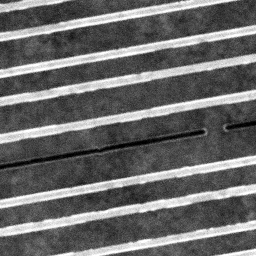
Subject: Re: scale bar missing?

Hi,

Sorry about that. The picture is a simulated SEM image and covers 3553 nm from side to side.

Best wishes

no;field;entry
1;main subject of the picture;parallel lines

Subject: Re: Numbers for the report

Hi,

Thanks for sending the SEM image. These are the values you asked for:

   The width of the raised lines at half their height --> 93.9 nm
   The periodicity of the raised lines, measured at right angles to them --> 32.2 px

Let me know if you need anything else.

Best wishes